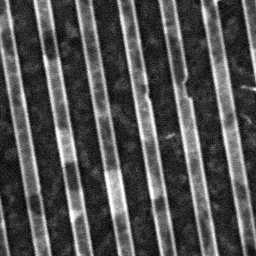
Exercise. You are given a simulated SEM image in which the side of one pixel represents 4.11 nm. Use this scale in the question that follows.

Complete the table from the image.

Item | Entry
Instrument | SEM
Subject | parallel lines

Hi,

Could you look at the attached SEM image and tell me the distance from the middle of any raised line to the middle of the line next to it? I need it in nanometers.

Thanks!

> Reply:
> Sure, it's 169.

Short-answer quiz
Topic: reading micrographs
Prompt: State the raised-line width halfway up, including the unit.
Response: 58.7 nanometres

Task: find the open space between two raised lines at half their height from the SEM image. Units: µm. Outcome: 0.111